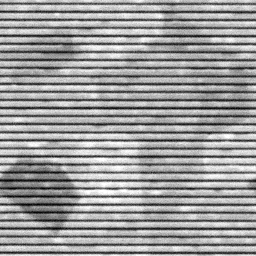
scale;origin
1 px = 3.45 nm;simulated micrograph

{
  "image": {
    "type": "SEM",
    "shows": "parallel lines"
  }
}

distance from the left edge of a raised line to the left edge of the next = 8.06 px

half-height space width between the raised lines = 6.5 nm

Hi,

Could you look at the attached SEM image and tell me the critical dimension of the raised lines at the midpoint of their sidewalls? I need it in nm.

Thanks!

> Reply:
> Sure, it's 19.4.